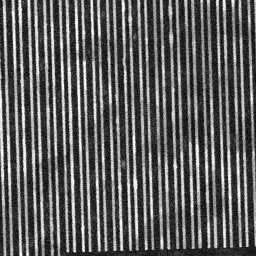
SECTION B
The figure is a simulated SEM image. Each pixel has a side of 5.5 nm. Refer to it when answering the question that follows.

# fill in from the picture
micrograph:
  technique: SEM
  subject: parallel lines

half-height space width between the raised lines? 0.0275 micrometres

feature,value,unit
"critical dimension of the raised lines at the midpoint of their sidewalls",10.3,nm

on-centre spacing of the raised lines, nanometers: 43.2